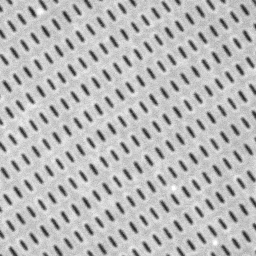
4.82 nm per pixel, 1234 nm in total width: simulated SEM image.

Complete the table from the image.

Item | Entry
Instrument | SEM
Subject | a regular array of holes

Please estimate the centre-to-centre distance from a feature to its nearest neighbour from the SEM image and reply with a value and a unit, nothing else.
0.0592 microns